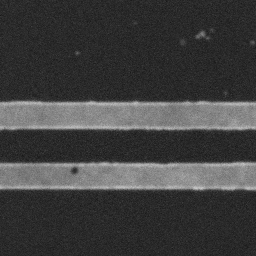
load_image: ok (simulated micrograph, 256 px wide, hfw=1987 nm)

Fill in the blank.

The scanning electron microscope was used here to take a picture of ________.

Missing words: lines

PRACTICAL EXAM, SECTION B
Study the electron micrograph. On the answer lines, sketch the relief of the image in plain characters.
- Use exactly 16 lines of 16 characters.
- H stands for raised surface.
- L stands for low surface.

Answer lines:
LLLLLLLLLLLLLLLL
LLLLLLLLLLLLLLLL
LLLLLLLLLLLLLLLL
LLLLLLLLLLLLLLLL
LLLLLLLLLLLLLLLL
LLLLLLLLLLLLLLLL
HHHHHHHHHHHHHHHH
HHHHHHHHHHHHHHHH
LLLLLLLLLLLLLLLL
LLLLLLLLLLLLLLLL
HHHHHHHHHHHHHHHH
HHHHHHHHHHHHHHHH
LLLLLLLLLLLLLLLL
LLLLLLLLLLLLLLLL
LLLLLLLLLLLLLLLL
LLLLLLLLLLLLLLLL